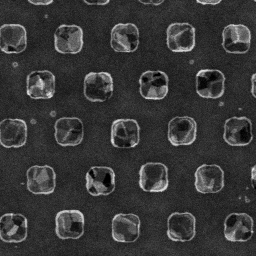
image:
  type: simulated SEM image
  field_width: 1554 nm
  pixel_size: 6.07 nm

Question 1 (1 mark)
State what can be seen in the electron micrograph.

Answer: a regular array of raised bodies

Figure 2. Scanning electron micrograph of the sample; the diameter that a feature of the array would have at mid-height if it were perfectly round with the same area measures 179 nm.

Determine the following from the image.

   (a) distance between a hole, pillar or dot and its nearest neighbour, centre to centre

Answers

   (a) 325 nm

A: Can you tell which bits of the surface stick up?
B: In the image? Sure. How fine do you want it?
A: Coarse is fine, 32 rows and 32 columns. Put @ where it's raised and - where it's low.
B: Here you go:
-------------------@------@-----
--------------------------------
--------------------------------
@@@----@@@----@@@----@@@----@@@-
@@@----@@@----@@@----@@@----@@@-
@@@----@@@----@@@----@@@----@@@-
-@------@@-------------------@--
--------------------------------
--------------------------------
----@@@----@@@----@@@----@@@----
---@@@@----@@@----@@@----@@@----
---@@@@----@@@----@@@----@@@----
--------------------------------
--------------------------------
--------------------------------
@@@----@@@----@@@----@@@----@@@-
@@@----@@@----@@@----@@@----@@@-
@@@----@@@----@@@----@@@----@@@-
--------------------------------
--------------------------------
------------------@@------------
----@@@----@@@----@@@----@@@----
----@@@----@@@----@@@----@@@----
----@@@----@@@----@@@----@@@----
--------------------------------
--------------------------------
--------@@----------------------
@@@----@@@----@@@----@@@----@@@-
@@@----@@@----@@@----@@@----@@@-
@@@-----@@----@@@----@@@----@@@-
--------------------------------
--------------------------------